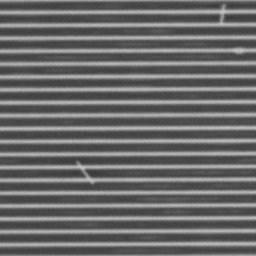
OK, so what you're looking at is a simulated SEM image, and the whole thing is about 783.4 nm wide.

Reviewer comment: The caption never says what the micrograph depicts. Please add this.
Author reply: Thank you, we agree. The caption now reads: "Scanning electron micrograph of parallel lines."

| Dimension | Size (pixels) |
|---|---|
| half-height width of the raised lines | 3.76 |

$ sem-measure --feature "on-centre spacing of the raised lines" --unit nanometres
39.5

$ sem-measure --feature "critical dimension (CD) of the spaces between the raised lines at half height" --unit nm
28.7